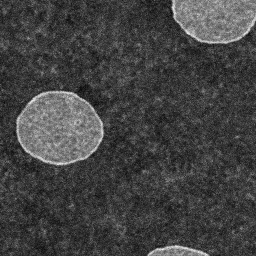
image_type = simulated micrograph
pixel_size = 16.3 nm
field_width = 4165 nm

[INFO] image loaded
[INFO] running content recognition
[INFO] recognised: raised bodies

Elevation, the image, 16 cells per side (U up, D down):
DDDDDDDDDDDUUUUU
DDDDDDDDDDDUUUUU
DDDDDDDDDDDDUUUD
DDDDDDDDDDDDDDDD
DDDDDDDDDDDDDDDD
DDDDDDDDDDDDDDDD
DDUUUUDDDDDDDDDD
DUUUUUDDDDDDDDDD
DUUUUUDDDDDDDDDD
DDUUUUDDDDDDDDDD
DDDDDDDDDDDDDDDD
DDDDDDDDDDDDDDDD
DDDDDDDDDDDDDDDD
DDDDDDDDDDDDDDDD
DDDDDDDDDDDDDDDD
DDDDDDDDDDUUDDDD